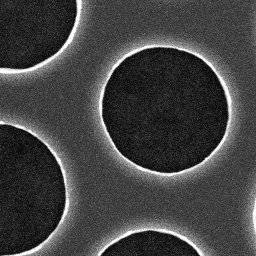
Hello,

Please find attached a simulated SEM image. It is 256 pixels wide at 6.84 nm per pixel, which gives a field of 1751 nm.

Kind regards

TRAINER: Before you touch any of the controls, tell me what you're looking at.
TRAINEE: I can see holes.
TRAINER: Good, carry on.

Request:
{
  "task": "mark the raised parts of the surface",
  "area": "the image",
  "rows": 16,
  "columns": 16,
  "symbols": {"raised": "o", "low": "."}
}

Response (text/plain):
.....ooooooooooo
.....ooooooooooo
....oooooooooooo
...ooooo....oooo
ooooooo......ooo
ooooooo.......oo
oooooo........oo
oooooo........oo
..ooooo.......oo
...oooo......ooo
....ooooo...oooo
....oooooooooooo
....oooooooooooo
....oooooooooooo
...oooooo.oooooo
..ooooo.....oooo